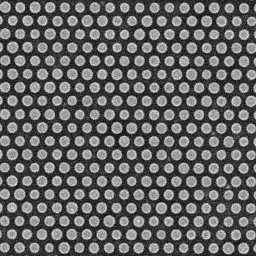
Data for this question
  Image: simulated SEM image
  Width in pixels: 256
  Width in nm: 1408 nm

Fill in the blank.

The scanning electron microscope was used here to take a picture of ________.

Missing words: a regular array of raised bodies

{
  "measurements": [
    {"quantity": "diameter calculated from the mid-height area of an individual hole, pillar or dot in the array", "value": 54.1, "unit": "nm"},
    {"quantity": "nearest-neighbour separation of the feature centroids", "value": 80.3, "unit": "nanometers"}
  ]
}